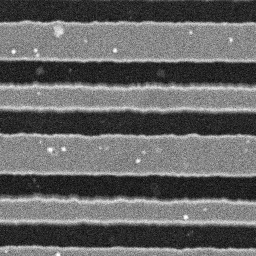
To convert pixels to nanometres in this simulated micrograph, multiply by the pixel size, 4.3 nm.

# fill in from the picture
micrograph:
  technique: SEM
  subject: lines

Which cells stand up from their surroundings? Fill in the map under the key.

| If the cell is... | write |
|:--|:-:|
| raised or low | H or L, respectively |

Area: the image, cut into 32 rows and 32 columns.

LLLLLLLLLLLLLLLLLLLLLLLLLLLLLLLL
LLLLLLLLLLLLLLLLLLLLLLLLLLLLLLLL
LLLLLLLLLLLLLLLLLLLLLLLLLLLLLLLL
HHHHHHHHHHHHHHHHHHHHHHHHHHHHHHHH
HHHHHHHHHHHHHHHHHHHHHHHHHHHHHHHH
HHHHHHHHHHHHHHHHHHHHHHHHHHHHHHHH
HHHHHHHHHHHHHHHHHHHHHHHHHHHHHHHH
LLLLLHHHHHHHHHHHHHHHHHHHHHHHHHHH
LLLLLLLLLLLLLLLLLLLLLLLLLLLLLLLL
LLLLLLLLLLLLLLLLLLLLLLLLLLLLLLLL
LLLLLLLLLLLLLLLLLLLLLLLLLLLLLLLL
HHHHHHHHHHHHHHHHHHHHHHHHHHHHHHHH
HHHHHHHHHHHHHHHHHHHHHHHHHHHHHHHH
HHHHHHHHHHHHHHHHHHHHHHHHHHHHHHHH
LLLLLLLLLLLLLLLLLLLLLLLLLLLLLLLL
LLLLLLLLLLLLLLLLLLLLLLLLLLLLLLLL
LLLLLLLLLLLLLLLLLLLLLLLLLLLLLLLL
HHHHHHHHHHHHHHHHHHHHHHHHHHHHHHHH
HHHHHHHHHHHHHHHHHHHHHHHHHHHHHHHH
HHHHHHHHHHHHHHHHHHHHHHHHHHHHHHHH
HHHHHHHHHHHHHHHHHHHHHHHHHHHHHHHH
HHHHHHHHHHHHHHHHHHHHHHHHHHHHHHHH
LLLLLLLLLLLLLLLLLLLLLLLLLLLLLLLL
LLLLLLLLLLLLLLLLLLLLLLLLLLLLLLLL
LLLLLLLLLLLLLLLLLLLLLLLLLLLLLLLL
HHHHHHHHHHHHHHHHHHHHHHHHHHHHHHHH
HHHHHHHHHHHHHHHHHHHHHHHHHHHHHHHH
HHHHHHHHHHHHHHHHHHHHHHHHHHHHHHHH
LLLLLLLLLLLLLLLLLLLLLLLLLLLLLLLL
LLLLLLLLLLLLLLLLLLLLLLLLLLLLLLLL
LLLLLLLLLLLLLLLLLLLLLLLLLLLLLLLL
HHHHHHHHHHHHHHHHHHHHHHHHHHHHHHHH